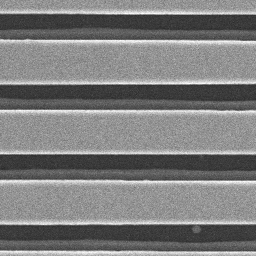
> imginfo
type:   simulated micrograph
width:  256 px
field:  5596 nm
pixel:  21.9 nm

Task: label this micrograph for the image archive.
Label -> lines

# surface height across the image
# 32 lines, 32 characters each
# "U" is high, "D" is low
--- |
UUUUUUUUUUUUUUUUUUUUUUUUUUUUUUUU
UUUUUUUUUUUUUUUUUUUUUUUUUUUUUUUU
DDDDDDDDDDDDDDDDDDDDDDDDDDDDDDDD
DDDDDDDDDDDDDDDDDDDDDDDDDDDDDDDD
DDDDDDDDDDDDDDDDDDDDDDDDDDDDDDDD
UUUUUUUUUUUUUUUUUUUUUUUUUUUUUUUU
UUUUUUUUUUUUUUUUUUUUUUUUUUUUUUUU
UUUUUUUUUUUUUUUUUUUUUUUUUUUUUUUU
UUUUUUUUUUUUUUUUUUUUUUUUUUUUUUUU
UUUUUUUUUUUUUUUUUUUUUUUUUUUUUUUU
DDDDDDDDDDDDDDDDDDDDDDDDDDDDDDDD
DDDDDDDDDDDDDDDDDDDDDDDDDDDDDDDD
DDDDDDDDDDDDDDDDDDDDDDDDDDDDDDDD
DDDDDDDDDDDDDDDDDDDDDDDDDDDDDDDD
UUUUUUUUUUUUUUUUUUUUUUUUUUUUUUUU
UUUUUUUUUUUUUUUUUUUUUUUUUUUUUUUU
UUUUUUUUUUUUUUUUUUUUUUUUUUUUUUUU
UUUUUUUUUUUUUUUUUUUUUUUUUUUUUUUU
UUUUUUUUUUUUUUUUUUUUUUUUUUUUUUUU
DDDDDDDDDDDDDDDDDDDDDDDDDDDDDDDD
DDDDDDDDDDDDDDDDDDDDDDDDDDDDDDDD
DDDDDDDDDDDDDDDDDDDDDDDDDDDDDDDD
DDDDDDDDDDDDDDDDDDDDDDDDDDDDDDDD
UUUUUUUUUUUUUUUUUUUUUUUUUUUUUUUU
UUUUUUUUUUUUUUUUUUUUUUUUUUUUUUUU
UUUUUUUUUUUUUUUUUUUUUUUUUUUUUUUU
UUUUUUUUUUUUUUUUUUUUUUUUUUUUUUUU
UUUUUUUUUUUUUUUUUUUUUUUUUUUUUUUU
DDDDDDDDDDDDDDDDDDDDDDDDDDDDDDDD
DDDDDDDDDDDDDDDDDDDDDDDDDDDDDDDD
DDDDDDDDDDDDDDDDDDDDDDDDDDDDDDDD
UUUUUUUUUUUUUUUUUUUUDDDDDDDDDDDD